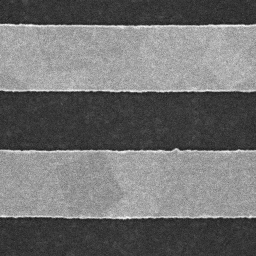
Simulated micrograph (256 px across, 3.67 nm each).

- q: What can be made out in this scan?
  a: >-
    one or a few lines or trenches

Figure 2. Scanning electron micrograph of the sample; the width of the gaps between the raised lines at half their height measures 218 nm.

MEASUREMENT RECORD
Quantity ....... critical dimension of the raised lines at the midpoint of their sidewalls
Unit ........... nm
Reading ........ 244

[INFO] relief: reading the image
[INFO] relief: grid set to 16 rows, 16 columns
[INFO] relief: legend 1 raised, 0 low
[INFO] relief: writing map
0000000000000000
0000000000000000
1111111111111111
1111111111111111
1111111111111111
1111111111111111
0000000000000000
0000000000000000
0000000000000000
1111111111111111
1111111111111111
1111111111111111
1111111111111111
1111111111111111
0000000000000000
0000000000000000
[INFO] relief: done